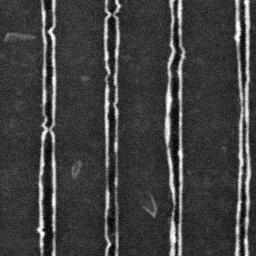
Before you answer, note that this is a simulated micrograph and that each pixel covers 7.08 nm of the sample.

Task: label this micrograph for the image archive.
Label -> one or a few lines or trenches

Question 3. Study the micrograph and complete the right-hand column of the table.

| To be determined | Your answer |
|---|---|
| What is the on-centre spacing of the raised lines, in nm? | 460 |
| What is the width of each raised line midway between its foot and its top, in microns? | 0.0735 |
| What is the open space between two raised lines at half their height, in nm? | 380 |